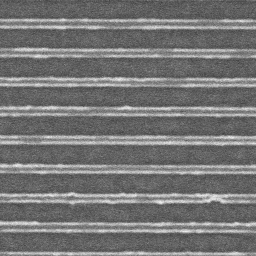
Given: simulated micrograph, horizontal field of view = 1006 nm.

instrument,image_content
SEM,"parallel lines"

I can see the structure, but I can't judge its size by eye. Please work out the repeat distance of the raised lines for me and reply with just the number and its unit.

114 nanometers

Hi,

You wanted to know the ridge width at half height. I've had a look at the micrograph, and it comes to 34.9 nm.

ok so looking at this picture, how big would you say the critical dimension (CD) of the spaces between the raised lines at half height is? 81.6 nm